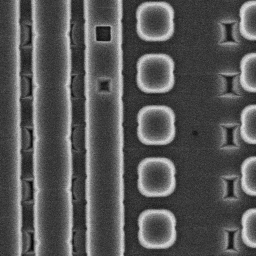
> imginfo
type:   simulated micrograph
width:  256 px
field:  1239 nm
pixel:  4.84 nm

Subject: wiring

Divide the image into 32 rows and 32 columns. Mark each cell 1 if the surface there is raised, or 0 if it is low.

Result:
11001111100111100011100000000001
11001111100111100111100000000011
11001111100111100111100000000011
11001111100111100111100000000011
11001111000111100011100000000001
11001111100111100000000000000000
11001111100111100000000000000000
11001111100111100011100000000011
11001111100111100111100000000011
11001111100111100111100000000011
11001111100111100111100000000011
11001111100111100000000000000000
11001111100111100000000000000000
11001111100111100011100000000001
11001111100111100111110000000011
11001111100111100111110000000011
11001111100111100111110000000011
11101111100111100011100000000001
11101111100111100000000000000000
11101111100111100000000000000000
11101111100111100011100000000011
11101111100111100111110000000011
11101111100111100111110000000011
11101111100111100011110000000001
11101111100111100000000000000000
11101111100111100000000000000000
11101111100111100011100000000001
11101111100111100111110000000011
11101111100111100111110000000011
11100111100111100111110000000011
11100111100111100011100000000001
11100111100111100000000000000000